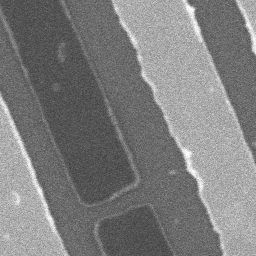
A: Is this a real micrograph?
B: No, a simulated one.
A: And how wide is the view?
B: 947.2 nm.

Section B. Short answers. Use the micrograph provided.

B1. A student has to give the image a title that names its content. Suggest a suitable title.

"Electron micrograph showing one or a few lines or trenches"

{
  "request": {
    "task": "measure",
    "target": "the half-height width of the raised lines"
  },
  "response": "240 nm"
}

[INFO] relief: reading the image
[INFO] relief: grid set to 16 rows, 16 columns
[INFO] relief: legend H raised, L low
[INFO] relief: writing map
HHHHLLLHHHHHLLLH
HHHHHLLLHHHHLLLH
LHHHHLLLHHHHHLLL
LHHHHLLLLHHHHLLL
LLHHHHLLLHHHHHLL
LLHHHHLLLHHHHHLL
LLHHHHHLLLHHHHLL
HLLHHHHLLLHHHHHL
HLLHHHHHLLLHHHHL
HHLLHHHHLLLHHHHH
HHLLHHHHLLLLHHHH
HHLLHHHHLLLLHHHH
HHHLLHHLLLLLLHHH
HHHLLLLHHHLLLHHH
HHHHLLHHHHLLLLHH
HHHHLLHHHHHLLLHH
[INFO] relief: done